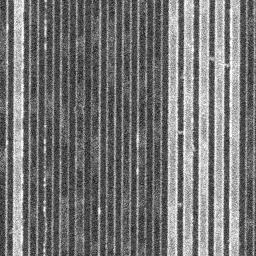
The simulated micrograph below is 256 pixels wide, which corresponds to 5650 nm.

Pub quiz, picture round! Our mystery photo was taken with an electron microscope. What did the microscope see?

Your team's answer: parallel lines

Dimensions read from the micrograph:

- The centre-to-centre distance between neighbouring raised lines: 342 nanometres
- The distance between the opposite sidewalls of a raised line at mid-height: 0.185 um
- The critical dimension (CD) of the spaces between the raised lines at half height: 168 nm